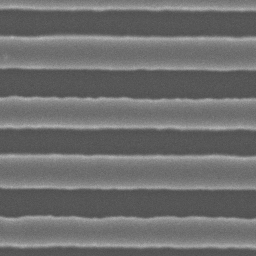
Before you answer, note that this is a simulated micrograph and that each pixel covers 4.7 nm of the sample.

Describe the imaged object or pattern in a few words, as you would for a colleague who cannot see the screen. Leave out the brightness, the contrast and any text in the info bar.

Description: lines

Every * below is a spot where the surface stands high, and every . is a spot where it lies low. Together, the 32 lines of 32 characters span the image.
********************************
................................
................................
................................
................................
********************************
********************************
********************************
...*****************************
................................
................................
................................
********************************
********************************
********************************
********************************
................................
................................
................................
.*....**........................
********************************
********************************
********************************
........**...****.*..***********
................................
................................
................................
********************************
********************************
********************************
********************************
................................